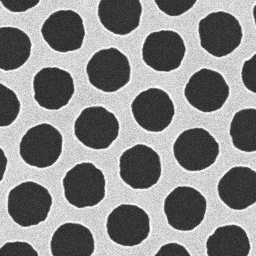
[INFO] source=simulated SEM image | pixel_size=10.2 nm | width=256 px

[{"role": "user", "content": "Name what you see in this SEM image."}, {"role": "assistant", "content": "a regular array of holes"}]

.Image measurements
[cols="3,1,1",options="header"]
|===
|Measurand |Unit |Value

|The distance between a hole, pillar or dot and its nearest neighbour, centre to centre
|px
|58.2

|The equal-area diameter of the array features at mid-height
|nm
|449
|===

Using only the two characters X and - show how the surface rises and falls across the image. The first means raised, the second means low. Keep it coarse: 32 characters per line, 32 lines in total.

-----XXXXXXX------XX----XXXXXXXX
XX-XXXX--XXX------XX---XXXX-XXXX
XXXXXX----XX-----XXXXXXXX-----XX
--XXX-----XXX----XXXXXXXX-----XX
----X------XXXXXXX-----XX-----XX
----XX----XXXXXXXX-----XX-----XX
----XXX-XXXX---XXX-----XXX---XXX
---XXXXXXXX-----XX-----XXXXXXXX-
--XXX--XXXX-----XXX---XXXXXXXX--
XXXX-----XX-----XXXXXXXX----XX--
XXXX-----XX-----XXXXXXX-----XX--
--XX-----XXXX-XXXX---XX------XXX
--XX-----XXXXXXXX----XX-----XXXX
--XXXX--XXX--XXX------XX----XXXX
--XXXXXXXX----XXX-----XXXXXXX---
-XXXX-XXX------XX----XXXXXXXX---
XXX----XX------XXXXXXXX---XXX---
XXX-----XX----XXXXXXXX-----XX---
XX------XXX--XXX---XXX-----XXX--
-XX----XXXXXXXX-----XX-----XXXXX
-XXX---XXX--XXX-----XX-----XXXXX
-XXXXXXX-----XX-----XXXXXXXX----
XXXXXXXX-----XX-----XXXXXXXX----
XX----XX-----XXXX--XXX--XXX-----
X-----XX-----XXXXXXXX----XX-----
X------XX---XXXXXXXX------XX----
X-----XXXXXXXX----XXX-----XXXXXX
XX----XXXXXXX------XX----XXXXXXX
XXXXXXX----XX------XXX--XXX---XX
XXXXXXX-----XX----XXXXXXXX-----X
X---XX------XXX--XXXX-XXXX-----X
-----X------XXXXXXXX----XX-----X